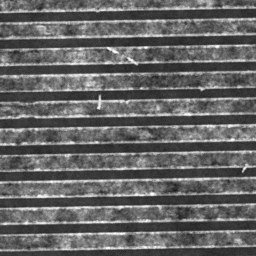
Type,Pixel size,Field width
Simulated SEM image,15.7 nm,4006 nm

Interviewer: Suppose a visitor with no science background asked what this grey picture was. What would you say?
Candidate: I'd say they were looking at parallel lines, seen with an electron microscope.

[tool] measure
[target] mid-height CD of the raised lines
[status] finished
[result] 0.25 µm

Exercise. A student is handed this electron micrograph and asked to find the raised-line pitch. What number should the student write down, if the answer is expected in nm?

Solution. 414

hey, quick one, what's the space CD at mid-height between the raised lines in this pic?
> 168 nanometres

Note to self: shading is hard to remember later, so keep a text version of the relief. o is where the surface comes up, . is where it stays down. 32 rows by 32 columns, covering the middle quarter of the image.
................................
................................
..........................oooooo
oooooooooooooooooooooooooooooooo
oooooooooooooooooooooooooooooooo
oooooooooooooooooooooooooooooooo
oo..............................
................................
................................
oooooooooooooooooooooooooooooooo
oooooooooooooooooooooooooooooooo
oooooooooooooooooooooooooooooooo
oooooooooooooooooooooooooooooooo
................................
................................
................................
oooooooooooooooooooooooooooooooo
oooooooooooooooooooooooooooooooo
oooooooooooooooooooooooooooooooo
ooooooooooo..ooo..oo.oo.........
................................
................................
..................oooooooooooooo
oooooooooooooooooooooooooooooooo
oooooooooooooooooooooooooooooooo
oooooooooooooooooooooooooooooooo
................................
................................
................................
.ooooooooooooooooooooooooooooooo
oooooooooooooooooooooooooooooooo
oooooooooooooooooooooooooooooooo